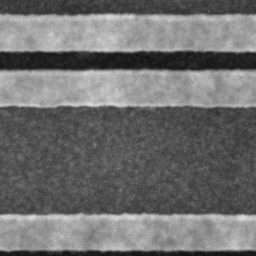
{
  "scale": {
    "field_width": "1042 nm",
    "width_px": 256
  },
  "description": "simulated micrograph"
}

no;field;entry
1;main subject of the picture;lines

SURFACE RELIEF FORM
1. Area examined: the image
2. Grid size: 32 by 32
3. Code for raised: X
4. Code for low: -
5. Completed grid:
--------------------------------
--------------------------------
XXXXXXXXXXXXXXXXXXXXXXXXXXXXXXXX
XXXXXXXXXXXXXXXXXXXXXXXXXXXXXXXX
XXXXXXXXXXXXXXXXXXXXXXXXXXXXXXXX
XXXXXXXXXXXXXXXXXXXXXXXXXXXXXXXX
--------------------------------
--------------------------------
--------------------------------
XXXXXXXXXXXXXXXXXXXXXXXXXXXXXXXX
XXXXXXXXXXXXXXXXXXXXXXXXXXXXXXXX
XXXXXXXXXXXXXXXXXXXXXXXXXXXXXXXX
XXXXXXXXXXXXXXXXXXXXXXXXXXXXXXXX
--------------------------------
--------------------------------
--------------------------------
--------------------------------
--------------------------------
--------------------------------
--------------------------------
--------------------------------
--------------------------------
--------------------------------
--------------------------------
--------------------------------
--------------------------------
--------------------------------
XXXXXXXXXXXXXXXXXXXXXXXXXXXXXXXX
XXXXXXXXXXXXXXXXXXXXXXXXXXXXXXXX
XXXXXXXXXXXXXXXXXXXXXXXXXXXXXXXX
XXXXXXXXXXXXXXXXXXXXXXXXXXXXXXXX
--------------------------------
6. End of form